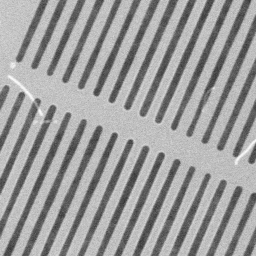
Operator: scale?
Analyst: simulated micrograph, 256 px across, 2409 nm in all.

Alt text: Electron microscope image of groups of lines, slits or small figures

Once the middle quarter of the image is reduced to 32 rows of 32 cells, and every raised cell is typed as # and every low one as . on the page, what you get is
#..##...##..##...##...##..##...#
..###..##...##..###..##...##..##
..###..##..###..##...##..##...##
..##..###..##...##..##...##..###
.###..##..###..##...##..###..##.
###..###..##...##..##...##...##.
#######...##..##...##..###..##..
#######..###..##..###..##...##..
###########..###..##...##..###..
###########..##...##..##...##..#
###############..##...##..###..#
###############.###..##...##..##
..#################..##..###..##
..#####################..##..###
.###..#################..##..###
.##...##.##################..##.
###..###..#################.###.
###..##..###..################..
##..###..##...##################
##..##...##..##...##############
#...##..##...##..###.###########
#..##...##..###..##...##########
...##..###..##..###..##..#######
..###..##..###..##...##..#######
..##..###..##...##..##...##..###
.###..##..###..##...##..###..###
.##..###..##...##..###..##...##.
###..##...##..##...##..###..##..
##...##..##...##...##..##...##..
##..##...##...#...##...##..###..
#...##..###..##...##..##...##..#
#..###..##...##..##...##..###..#